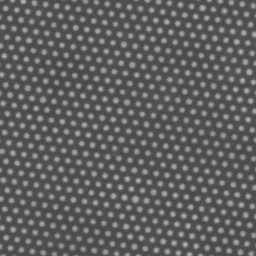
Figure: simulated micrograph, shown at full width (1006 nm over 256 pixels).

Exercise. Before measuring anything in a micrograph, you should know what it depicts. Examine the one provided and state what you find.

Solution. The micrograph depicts a regular array of raised bodies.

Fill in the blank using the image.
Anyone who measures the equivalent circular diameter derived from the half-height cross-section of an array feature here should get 20.3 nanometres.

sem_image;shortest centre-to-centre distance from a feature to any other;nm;42.1